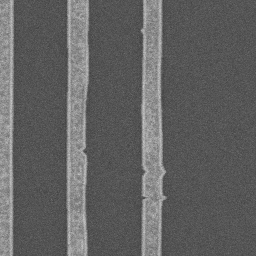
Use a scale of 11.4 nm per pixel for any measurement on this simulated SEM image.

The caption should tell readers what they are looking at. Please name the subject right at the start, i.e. one or a few lines or trenches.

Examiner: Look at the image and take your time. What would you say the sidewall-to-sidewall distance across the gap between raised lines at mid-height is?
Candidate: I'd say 669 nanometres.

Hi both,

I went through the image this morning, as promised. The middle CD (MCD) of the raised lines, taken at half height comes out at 180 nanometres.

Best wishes